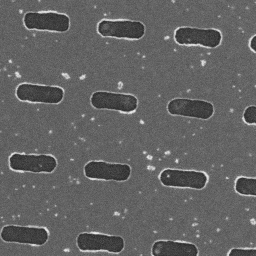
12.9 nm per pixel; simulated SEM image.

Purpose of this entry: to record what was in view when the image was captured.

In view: a regular array of holes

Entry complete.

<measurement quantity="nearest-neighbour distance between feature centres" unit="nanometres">914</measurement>